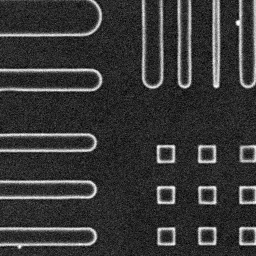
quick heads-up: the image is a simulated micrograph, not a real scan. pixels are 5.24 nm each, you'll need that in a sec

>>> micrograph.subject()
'groups of lines, slits or small figures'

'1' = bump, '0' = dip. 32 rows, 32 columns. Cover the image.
11111111111100000011001100000011
11111111111110000011001100000011
11111111111110000011001100000011
11111111111100000011001100000011
00000000000000000011001100000011
00000000000000000011001100000011
00000000000000000011001100000011
00000000000000000011001100000011
00000000000000000011001100000011
11111111111110000011001100000011
11111111111110000011000100000011
00000000000000000000000000000000
00000000000000000000000000000000
00000000000000000000000000000000
00000000000000000000000000000000
00000000000000000000000000000000
00000000000000000000000000000000
11111111111100000000000000000000
11111111111100000000110001100011
00000000000000000000110001100011
00000000000000000000000000000000
00000000000000000000000000000000
00000000000000000000000000000000
11111111111100000000110001100011
11111111111100000000110001100011
00000000000000000000000000000000
00000000000000000000000000000000
00000000000000000000000000000000
00000000000000000000000000000000
11111111111100000000110001100011
11111111111000000000010000000011
00000000000000000000000000000000